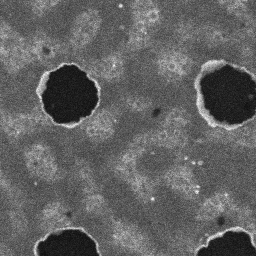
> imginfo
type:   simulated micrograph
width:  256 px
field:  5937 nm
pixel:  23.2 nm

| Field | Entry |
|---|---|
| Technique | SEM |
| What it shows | holes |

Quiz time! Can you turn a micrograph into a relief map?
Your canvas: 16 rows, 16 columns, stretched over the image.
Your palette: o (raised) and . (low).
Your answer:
oooooooooooooooo
oooooooooooooooo
oooooooooooooooo
oooooooooooooooo
ooo..oooooooo..o
ooo...ooooooo...
ooo...ooooooo...
ooo..oooooooo..o
oooooooooooooooo
oooooooooooooooo
oooooooooooooooo
oooooooooooooooo
oooooooooooooooo
oooooooooooooooo
ooo..ooooooooo.o
oo....ooooooo...